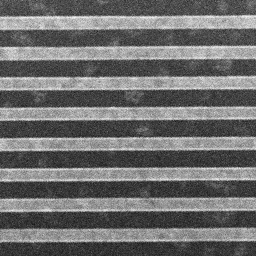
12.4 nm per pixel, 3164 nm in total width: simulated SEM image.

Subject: parallel lines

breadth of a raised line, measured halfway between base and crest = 144 nanometres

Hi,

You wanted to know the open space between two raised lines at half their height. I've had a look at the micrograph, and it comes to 232 nm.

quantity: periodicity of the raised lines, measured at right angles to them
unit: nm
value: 375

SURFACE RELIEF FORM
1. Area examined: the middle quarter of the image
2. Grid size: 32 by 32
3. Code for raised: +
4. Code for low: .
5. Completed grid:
................................
................................
................................
................................
++++++++++++++++++++++++++++++++
++++++++++++++++++++++++++++++++
................................
................+...............
................................
................................
................................
++++++++++++++++++++++++++++++++
++++++++++++++++++++++++++++++++
++++++++++++++++++++++++++++++++
................................
................................
................................
................................
................................
++++++++++++++++++++++++++++++++
++++++++++++++++++++++++++++++++
................................
................................
................................
................................
................................
++++++++++++++++++++++++++++++++
++++++++++++++++++++++++++++++++
++++++++++++++++++++++++++++++++
................................
................................
................................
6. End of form